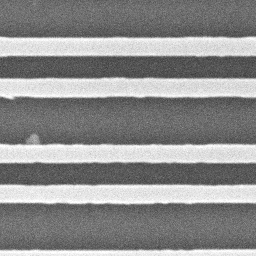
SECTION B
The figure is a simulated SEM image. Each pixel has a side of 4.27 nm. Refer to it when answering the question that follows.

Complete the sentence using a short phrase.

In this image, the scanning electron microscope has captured lines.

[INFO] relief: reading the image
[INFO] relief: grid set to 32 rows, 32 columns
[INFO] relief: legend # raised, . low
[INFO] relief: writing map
................................
................................
................................
................................
................................
################################
################################
................................
................................
................................
################################
################################
................................
................................
................................
................................
................................
................................
################################
################################
................................
................................
................................
################################
################################
................................
................................
................................
................................
................................
................................
################################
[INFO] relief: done